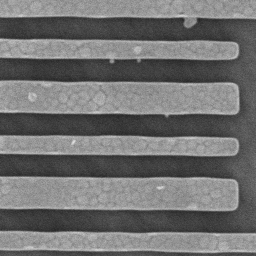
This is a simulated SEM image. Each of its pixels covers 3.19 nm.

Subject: groups of lines, slits or small figures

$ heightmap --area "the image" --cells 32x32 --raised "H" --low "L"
HHHHHHHHHHHHHHHHHHHHHHHHHHHHHHHH
HHHHHHHHHHHHHHHHHHHHHHHHHHHHHHHH
LLLLLLLLLLLLLLLLLLLLLLLLLLLLLLLL
LLLLLLLLLLLLLLLLLLLLLLLLLLLLLLLL
LLLLLLLLLLLLLLLLLLLLLLLLLLLLLLLL
HHHHHHHHHHHHHHHHHHHHHHHHHHHHHLLL
HHHHHHHHHHHHHHHHHHHHHHHHHHHHHHLL
LLLLLLLLLLLLLLLLLLLLLLLLLLLLLLLL
LLLLLLLLLLLLLLLLLLLLLLLLLLLLLLLL
LLLLLLLLLLLLLLLLLLLLLLLLLLLLLLLL
HHHHHHHHHHHHHHHHHHHHHHHHHHHHHLLL
HHHHHHHHHHHHHHHHHHHHHHHHHHHHHHLL
HHHHHHHHHHHHHHHHHHHHHHHHHHHHHHLL
HHHHHHHHHHHHHHHHHHHHHHHHHHHHHHLL
LLLLLLLLLLLLLLLLLLLLLLLLLLLLLLLL
LLLLLLLLLLLLLLLLLLLLLLLLLLLLLLLL
LLLLLLLLLLLLLLLLLLLLLLLLLLLLLLLL
HHHHHHHHHHHHHHHHHHHHHHHHHHHHHHLL
HHHHHHHHHHHHHHHHHHHHHHHHHHHHHHLL
LLLLLLLLLLLLLLLLLLLLLLLLLLLLLLLL
LLLLLLLLLLLLLLLLLLLLLLLLLLLLLLLL
LLLLLLLLLLLLLLLLLLLLLLLLLLLLLLLL
HHHHHHHHHHHHHHHHHHHHHHHHHHHHHLLL
HHHHHHHHHHHHHHHHHHHHHHHHHHHHHHLL
HHHHHHHHHHHHHHHHHHHHHHHHHHHHHHLL
HHHHHHHHHHHHHHHHHHHHHHHHHHHHHHLL
LLLLLLLLLLLLLLLLLLLLLLLLLLLLLLLL
LLLLLLLLLLLLLLLLLLLLLLLLLLLLLLLL
LLLLLLLLLLLLLLLLLLLLLLLLLLLLLLLL
HHHHHHHHHHHHHHHHHHHHHHHHHHHHHHHH
HHHHHHHHHHHHHHHHHHHHHHHHHHHHHHHH
LLLLLLLLLLLLLLLLLLLLLLLLHHHHLLLH